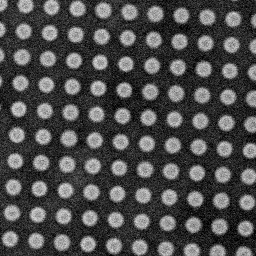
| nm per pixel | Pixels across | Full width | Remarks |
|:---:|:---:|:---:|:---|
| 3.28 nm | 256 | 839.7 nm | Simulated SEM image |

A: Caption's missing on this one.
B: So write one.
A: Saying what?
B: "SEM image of an array of small figures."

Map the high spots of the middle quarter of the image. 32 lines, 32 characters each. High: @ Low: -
-@@@---@@@@---@@@---@@@@---@@@--
--------------@@@---@@@@---@@@--
---------------------------@@@--
--------------------------------
-@@@----@-----------------------
@@@@---@@@----@@@---@@@---------
@@@@---@@@---@@@@---@@@---@@@@--
-@@----@@@---@@@@---@@@---@@@@--
--------------------@@@---@@@@--
--------------------------------
-@@-----------------------------
@@@----@@@----@@----------------
@@@---@@@@---@@@@--@@@@---@@@---
@@@---@@@@---@@@---@@@@---@@@---
-------------@@@---@@@@---@@@---
---------------------------@@---
--------------------------------
@@@----@@-----------------------
@@@---@@@@--@@@@----@@----------
@@@---@@@@--@@@@---@@@@--@@@@---
@@----@@@----@@@---@@@@--@@@@---
--------------------@@----@@@---
--------------------------------
@@------------------------------
@@@---@@@----@@-----@-----------
@@@--@@@@---@@@@--@@@@---@@@----
@@----@@@---@@@@--@@@@---@@@@---
-------------@@----@@@---@@@@--@
--------------------------@@----
--------------------------------
@@----@@------------------------
@@---@@@@---@@@----@@-----------